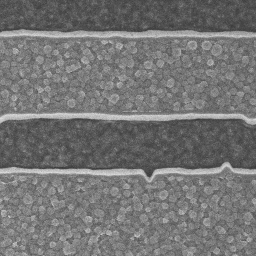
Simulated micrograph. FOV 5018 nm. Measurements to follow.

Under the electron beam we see one or a few lines or trenches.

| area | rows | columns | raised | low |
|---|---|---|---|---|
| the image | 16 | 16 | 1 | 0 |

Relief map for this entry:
0000000000000000
0000000000000000
1111111111111111
1111111111111111
1111111111111111
1111111111111111
1111111111111111
0000000000000000
0000000000000000
0000000000000000
0000000000000000
1111111111111111
1111111111111111
1111111111111111
1111111111111111
1111111111111111